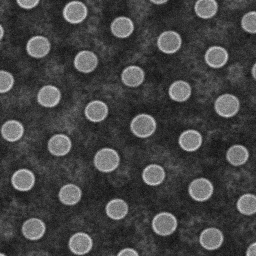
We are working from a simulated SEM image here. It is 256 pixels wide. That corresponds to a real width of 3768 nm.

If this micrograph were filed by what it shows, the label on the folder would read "a regular array of raised bodies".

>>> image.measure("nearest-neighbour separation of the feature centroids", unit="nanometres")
726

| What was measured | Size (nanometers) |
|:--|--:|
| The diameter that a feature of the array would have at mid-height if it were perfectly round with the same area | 318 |